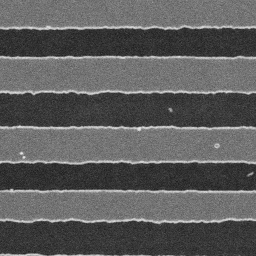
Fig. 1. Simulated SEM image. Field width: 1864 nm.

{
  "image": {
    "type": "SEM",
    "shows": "lines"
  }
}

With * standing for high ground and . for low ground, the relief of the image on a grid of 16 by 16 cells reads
****************
****************
................
................
****************
****************
................
................
****************
****************
................
................
****************
****************
................
................